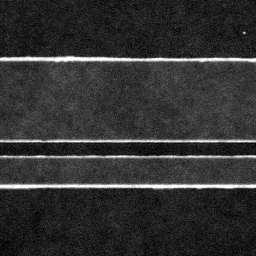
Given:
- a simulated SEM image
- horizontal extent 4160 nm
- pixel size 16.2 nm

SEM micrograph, lines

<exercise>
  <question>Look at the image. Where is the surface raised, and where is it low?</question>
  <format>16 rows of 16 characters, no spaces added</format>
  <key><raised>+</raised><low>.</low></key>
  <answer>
................
................
................
................
++++++++++++++++
++++++++++++++++
++++++++++++++++
++++++++++++++++
++++++++++++++++
++++++++++++++++
++++++++++++++++
++++++++++++++++
................
................
................
................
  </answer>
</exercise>